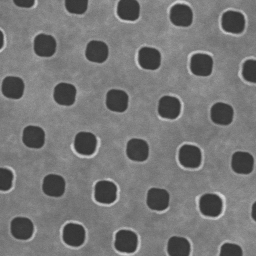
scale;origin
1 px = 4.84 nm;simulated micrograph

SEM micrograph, a regular array of holes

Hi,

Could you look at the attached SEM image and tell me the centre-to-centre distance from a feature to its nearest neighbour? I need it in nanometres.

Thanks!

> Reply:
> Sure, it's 254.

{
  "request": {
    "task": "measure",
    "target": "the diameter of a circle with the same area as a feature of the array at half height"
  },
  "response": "114 nm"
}